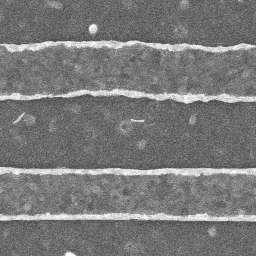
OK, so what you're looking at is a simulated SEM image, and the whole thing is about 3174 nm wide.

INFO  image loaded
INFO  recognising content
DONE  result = one or a few lines or trenches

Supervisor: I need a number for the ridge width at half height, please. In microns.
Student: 0.6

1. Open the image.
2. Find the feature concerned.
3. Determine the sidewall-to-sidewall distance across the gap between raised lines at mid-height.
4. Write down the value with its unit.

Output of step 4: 918 nm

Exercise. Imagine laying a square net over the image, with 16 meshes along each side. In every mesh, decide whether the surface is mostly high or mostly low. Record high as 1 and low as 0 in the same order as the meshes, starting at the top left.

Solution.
0000000000000000
0000000000000000
0000000000000000
1111111111111111
1111111111111111
1111111111111111
0000000000000000
0000000000000000
0000000000000000
0000000000000000
0000000000000000
1111111111111111
1111111111111111
1111111111111111
0000000000000000
0000000000000000